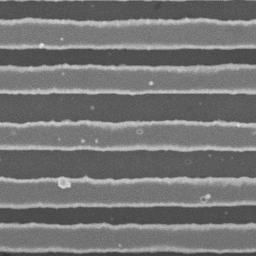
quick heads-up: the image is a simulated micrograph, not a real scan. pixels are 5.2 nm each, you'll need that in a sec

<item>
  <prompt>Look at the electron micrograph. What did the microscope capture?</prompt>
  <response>lines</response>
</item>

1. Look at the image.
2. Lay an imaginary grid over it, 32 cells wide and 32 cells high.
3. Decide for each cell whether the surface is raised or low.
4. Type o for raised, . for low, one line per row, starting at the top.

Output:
................................
................................
.ooooooo.........oooooooooo.....
oooooooooooooooooooooooooooooooo
oooooooooooooooooooooooooooooooo
oooooooooooooooooooooooooooooooo
................................
................................
oooooooooooooooooooooooooooooooo
oooooooooooooooooooooooooooooooo
oooooooooooooooooooooooooooooooo
oooooooooooooooooooooooooooooooo
................................
................................
................................
oo.ooooooooooooooooooooooooooooo
oooooooooooooooooooooooooooooooo
oooooooooooooooooooooooooooooooo
oooooooooooooooooooooooooooooooo
................................
................................
................................
oooooooooooooooooooooooooooooooo
oooooooooooooooooooooooooooooooo
oooooooooooooooooooooooooooooooo
oooooooooooooooooooooooooooooooo
................................
................................
oooooooooooooooooooooooooooooooo
oooooooooooooooooooooooooooooooo
oooooooooooooooooooooooooooooooo
..ooo...oooooo.o.o....oooooooooo